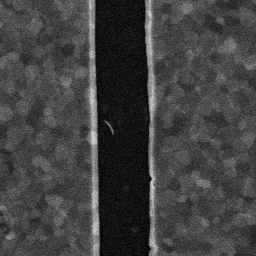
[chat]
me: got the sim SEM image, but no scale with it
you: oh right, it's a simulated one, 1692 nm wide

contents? one or a few lines or trenches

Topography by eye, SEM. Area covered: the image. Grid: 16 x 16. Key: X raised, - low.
XXXXXX---XXXXXXX
XXXXXX---XXXXXXX
XXXXXX---XXXXXXX
XXXXXX---XXXXXXX
XXXXXX---XXXXXXX
XXXXXX---XXXXXXX
XXXXXX---XXXXXXX
XXXXXX---XXXXXXX
XXXXXX---XXXXXXX
XXXXXX---XXXXXXX
XXXXXX---XXXXXXX
XXXXXX---XXXXXXX
XXXXXX---XXXXXXX
XXXXXX----XXXXXX
XXXXXX----XXXXXX
XXXXXX----XXXXXX